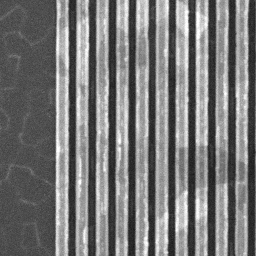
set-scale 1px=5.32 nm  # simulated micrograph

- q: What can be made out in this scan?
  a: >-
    parallel lines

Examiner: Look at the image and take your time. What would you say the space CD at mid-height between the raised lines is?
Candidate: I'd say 9.38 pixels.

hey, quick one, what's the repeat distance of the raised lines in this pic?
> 0.106 µm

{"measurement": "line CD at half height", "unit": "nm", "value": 55.2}